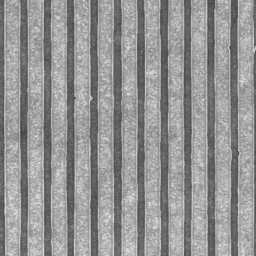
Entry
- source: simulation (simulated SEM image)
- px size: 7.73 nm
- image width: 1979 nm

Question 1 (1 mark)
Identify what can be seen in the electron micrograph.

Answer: parallel lines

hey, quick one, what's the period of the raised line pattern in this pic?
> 180 nm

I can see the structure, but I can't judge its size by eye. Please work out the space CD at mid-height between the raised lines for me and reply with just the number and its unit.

8.01 pixels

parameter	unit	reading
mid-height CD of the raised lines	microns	0.116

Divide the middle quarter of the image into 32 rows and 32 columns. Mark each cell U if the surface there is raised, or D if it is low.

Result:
UDDUUUDDDUUUDDDUUUDDUUUUDDUUUUDD
UDDUUUDDDUUUDDDUUUDDUUUUDDUUUUDD
UDDUUUDDDUUUDDDUUUDDUUUUDDUUUUDD
UDDUUUDDDUUUDDDUUUDDUUUUDDUUUUDD
UDDUUUDDDUUUDDDUUUDDDUUUDDUUUUDD
UDDUUUDDDUUUDDDUUUDDUUUUDDUUUUDD
UDDUUUDDDUUUDDDUUUDDUUUUDDUUUUDD
UDDUUUDDDUUUDDDUUUDDUUUUDDUUUUDD
UDDUUUUDDUUUDDDUUUDDUUUUDDUUUUDD
UDDUUUDDDUUUDDDUUUDDUUUUDDUUUUDD
UDDUUUDDDUUUDDDUUUDDUUUUDDUUUUDD
UDDUUUDDDUUUDDDUUUDDUUUUDDUUUUDD
UDDUUUDDDUUUDDDUUUDDUUUUDDUUUUDD
UDDUUUDDDUUUDDDUUUDDUUUUDDUUUUDD
UDDUUUDDDUUUDDDUUUDDUUUUDDUUUUDD
UDDUUUDDDUUUDDDUUUDDUUUUDDUUUUDD
UDDUUUDDDUUUDDDUUUDDUUUUDDUUUUDD
UDDUUUDDDUUUDDDUUUDDUUUUDDUUUUDD
UDDUUUDDDUUUDDDUUUDDUUUUDDUUUUDD
UDDUUUDDDUUUDDDUUUDDUUUUDDUUUUDD
UDDUUUDDDUUUDDDUUUDDUUUUDDUUUUDD
UDDUUUDDDUUUDDDUUUDDUUUUDDUUUUDD
UDDUUUDDDUUUDDDUUUDDUUUUDDUUUUDD
DDDUUUDDDUUUDDDUUUDDUUUUDDUUUUDD
DDDUUUDDDUUUDDDUUUDDUUUUDDUUUUDD
DDDUUUUDDUUUDDDUUUDDUUUUDDUUUUDD
DDDUUUUDDUUUDDDUUUDDUUUUDDUUUUDD
DDDUUUUDDUUUDDDUUUDDUUUUDDUUUUDD
DDDUUUUDDUUUDDDUUUDDUUUUDDUUUUDD
DDDUUUUDDUUUDDDUUUDDUUUUDDUUUUDD
DDDUUUUDDUUUDDDUUUDDUUUUDDUUUUDD
DDDUUUUDDUUUDDDUUUDDUUUUDDUUUUDD